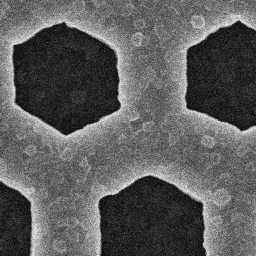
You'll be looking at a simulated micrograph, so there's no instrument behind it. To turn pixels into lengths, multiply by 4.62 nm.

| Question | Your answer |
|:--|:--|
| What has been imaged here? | holes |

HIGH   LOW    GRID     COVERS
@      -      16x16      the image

@@@@@@@@@@@@@@@@
@@@@@@@@@@@@@@@@
@@----@@@@@@@---
@------@@@@@----
@------@@@@@----
@------@@@@@----
@------@@@@@----
@@----@@@@@@@@--
@@@@@@@@@@@@@@@@
@@@@@@@@@@@@@@@@
@@@@@@@@@@@@@@@@
@@@@@@@@---@@@@@
--@@@@------@@@@
--@@@@-------@@@
--@@@@-------@@@
--@@@@-------@@@